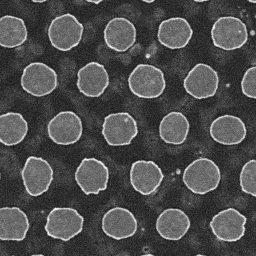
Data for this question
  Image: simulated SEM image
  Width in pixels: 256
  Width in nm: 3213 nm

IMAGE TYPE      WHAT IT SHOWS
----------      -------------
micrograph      a regular array of raised bodies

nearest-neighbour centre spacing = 676 nanometres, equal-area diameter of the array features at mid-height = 33.2 px